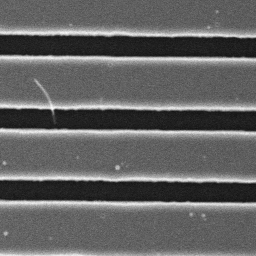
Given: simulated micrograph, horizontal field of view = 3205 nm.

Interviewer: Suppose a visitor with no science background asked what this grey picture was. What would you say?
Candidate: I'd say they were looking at lines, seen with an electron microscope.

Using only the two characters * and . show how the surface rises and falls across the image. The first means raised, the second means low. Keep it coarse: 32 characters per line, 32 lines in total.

********************************
********************************
********************************
********************************
................*.**************
................................
................................
********************************
********************************
********************************
********************************
********************************
********************************
.*******************************
................................
................................
********************************
********************************
********************************
********************************
********************************
********************************
**.*****************************
................................
................................
********************************
********************************
********************************
********************************
********************************
********************************
********************************